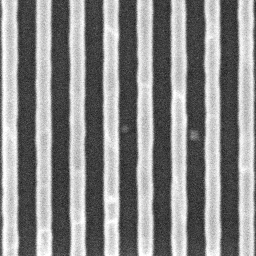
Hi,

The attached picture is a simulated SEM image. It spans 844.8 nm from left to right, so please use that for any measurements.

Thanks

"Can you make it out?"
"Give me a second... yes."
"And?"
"groups of lines, slits or small figures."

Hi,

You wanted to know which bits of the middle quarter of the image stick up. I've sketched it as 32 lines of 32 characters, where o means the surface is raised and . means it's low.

..ooo.....ooo......ooo.....ooo..
..ooo.....ooo......ooo.....ooo..
..ooo.....ooo.....oooo.....ooo..
..ooo.....ooo.....oooo.....ooo..
..ooo.....oooo....oooo.....ooo..
..ooo.....oooo.....ooo.....ooo..
..ooo.....oooo.....ooo.....ooo..
..ooo.....oooo.....ooo.....ooo..
..ooo.....ooo......ooo.....ooo..
..ooo.....ooo.....oooo.....ooo..
..ooo.....ooo.....oooo.....ooo..
..ooo.....ooo......ooo.....ooo..
..ooo.....ooo.....oooo.....ooo..
..ooo.....ooo.....oooo.....ooo..
..ooo.....ooo.....oooo.....ooo..
..ooo.....ooo.....oooo.....ooo..
..ooo.....ooo......ooo.....ooo..
..ooo.....ooo......ooo.....ooo..
..ooo.....ooo......ooo.....ooo..
..ooo.....oooo.....ooo.....ooo..
..ooo.....oooo.....ooo.....ooo..
..ooo.....oooo.....ooo.....ooo..
..ooo.....oooo.....ooo.....ooo..
..ooo.....oooo.....ooo.....ooo..
..ooo.....oooo.....ooo.....ooo..
..ooo.....oooo....oooo.....ooo..
..ooo.....oooo....oooo.....ooo..
..ooo.....oooo....oooo.....ooo..
..ooo.....oooo....oooo.....ooo..
..ooo.....oooo....oooo.....ooo..
..ooo.....oooo....oooo.....ooo..
..ooo.....oooo.....ooo.....ooo..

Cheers